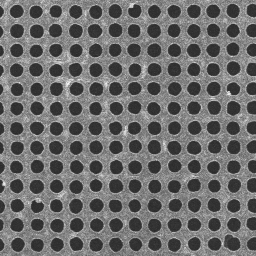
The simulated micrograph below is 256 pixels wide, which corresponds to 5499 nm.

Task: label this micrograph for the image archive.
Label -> a regular array of holes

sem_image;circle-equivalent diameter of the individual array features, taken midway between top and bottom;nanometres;293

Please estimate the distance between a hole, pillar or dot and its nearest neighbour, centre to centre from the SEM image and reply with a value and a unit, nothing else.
409 nanometers